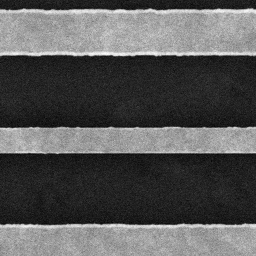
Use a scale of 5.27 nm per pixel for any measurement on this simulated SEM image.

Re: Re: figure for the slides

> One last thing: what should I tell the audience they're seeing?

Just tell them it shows lines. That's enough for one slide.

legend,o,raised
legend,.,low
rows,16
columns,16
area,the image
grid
................
oooooooooooooooo
oooooooooooooooo
................
................
................
................
................
oooooooooooooooo
oooooooooooooooo
................
................
................
................
oooooooooooooooo
oooooooooooooooo